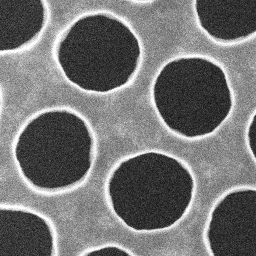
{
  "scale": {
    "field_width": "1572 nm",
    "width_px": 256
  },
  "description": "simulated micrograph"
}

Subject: holes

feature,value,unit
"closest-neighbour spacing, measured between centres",634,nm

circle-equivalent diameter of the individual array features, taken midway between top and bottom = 79.3 px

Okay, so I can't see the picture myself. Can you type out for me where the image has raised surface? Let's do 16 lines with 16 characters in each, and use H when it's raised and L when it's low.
LLLHHHHHHHHHLLLL
LLLHHLLLHHHHHLLL
LLHHLLLLLHHHHHLH
HHHHLLLLLHHHHHHH
HHHHLLLLHHLLLLHH
HHHHHLLHHHLLLLHH
HHHHHHHHHHLLLLHH
HHLLLHHHHHLLLLHH
HLLLLLHHHHHHHHHH
HLLLLLHHHHHHHHHH
HLLLLLHLLLLLHHHH
HHLLLHHLLLLLHHHH
HHHHHHHLLLLLHHLL
LLHHHHHLLLLHHLLL
LLLHHHHHHHHHHLLL
LLLHHHLHHHHHHLLL